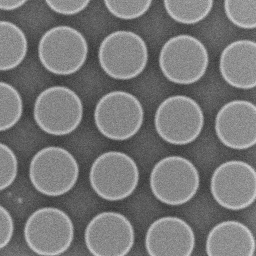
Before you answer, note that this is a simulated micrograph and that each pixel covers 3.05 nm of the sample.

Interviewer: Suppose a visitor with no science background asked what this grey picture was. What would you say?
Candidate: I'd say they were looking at an array of small figures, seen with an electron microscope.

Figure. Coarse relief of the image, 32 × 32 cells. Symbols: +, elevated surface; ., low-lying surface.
+++...+++++..++++++..+++++..++++
.......+++....++++...+++++..++++
......................+++....+++
++.....++.......................
+++...++++....+++...............
+++..++++++..+++++...++++....+++
+++..++++++.++++++..++++++..++++
+++..++++++..+++++..++++++..++++
+.....++++...+++++..++++++..++++
..............+++....++++...++++
+............................+++
++....+++.......................
+++..+++++...++++....+++........
+++.++++++..++++++..+++++...++++
++..++++++..++++++..+++++..+++++
++...+++++..++++++.++++++..+++++
......+++....++++...+++++..+++++
.....................+++....++++
+...............................
++...++++....+++................
++..++++++..+++++...++++....+++.
++..++++++.++++++..++++++..+++++
++..+++++..++++++..++++++..+++++
.....++++...+++++..++++++.++++++
.............+++....++++...+++++
............................+++.
+....+++........................
+...+++++...++++....++..........
++.++++++..+++++...+++++...++++.
+..++++++..++++++.++++++..+++++.
+...+++++..+++++..++++++..++++++
.....+++...+++++...+++++..++++++